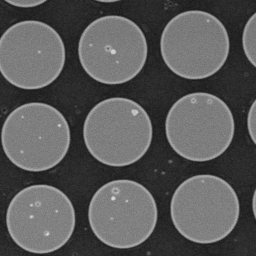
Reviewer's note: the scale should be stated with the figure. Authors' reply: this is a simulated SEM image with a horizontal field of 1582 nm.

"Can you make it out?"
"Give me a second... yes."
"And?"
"an array of small figures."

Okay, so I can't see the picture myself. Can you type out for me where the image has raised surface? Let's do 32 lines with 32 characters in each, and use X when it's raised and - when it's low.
-XXXX---------------------------
-----------------------XXX------
------------XXXX-----XXXXXX----X
-XXXXX-----XXXXXX----XXXXXXX---X
XXXXXXX---XXXXXXXX--XXXXXXXXX-XX
XXXXXXXX--XXXXXXXX--XXXXXXXXX-XX
XXXXXXXX--XXXXXXXX--XXXXXXXXX--X
XXXXXXXX--XXXXXXXX--XXXXXXXX---X
XXXXXXXX--XXXXXXXX---XXXXXX-----
XXXXXXX----XXXXXX-----XXXX------
--XXXX-------X------------------
--------------------------------
-------------XXX------XXXXXX----
--XXXXX-----XXXXXX---XXXXXXXX--X
-XXXXXXX---XXXXXXXX--XXXXXXXX--X
XXXXXXXX---XXXXXXXX--XXXXXXXX--X
XXXXXXXXX-XXXXXXXXX--XXXXXXXX--X
XXXXXXXXX-XXXXXXXXX--XXXXXXXX---
XXXXXXXXX--XXXXXXXX---XXXXXX----
-XXXXXXX----XXXXXX-----XXXX-----
--XXXXX------XXX----------------
--------------------------------
---------------X-------XXXXX----
---XXXX------XXXXX----XXXXXXX---
--XXXXXX----XXXXXXX---XXXXXXXX--
-XXXXXXXX--XXXXXXXX--XXXXXXXXX--
-XXXXXXXX--XXXXXXXXX-XXXXXXXXX--
-XXXXXXXX--XXXXXXXXX--XXXXXXXX--
-XXXXXXXX--XXXXXXXX---XXXXXXX---
-XXXXXXXX---XXXXXXX----XXXXX----
--XXXXXX-----XXXXX--------------
----XX--------------------------